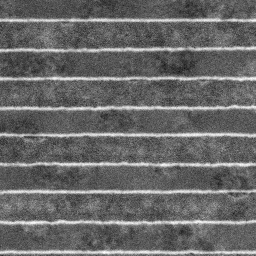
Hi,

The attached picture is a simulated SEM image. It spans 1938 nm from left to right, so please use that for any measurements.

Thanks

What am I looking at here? lines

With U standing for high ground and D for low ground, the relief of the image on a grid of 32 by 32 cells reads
UUUUUUUUUUUUUUUUUUUUUUUUUUUUUUUU
UUUUUUUUUUUUUUUUUUUUUUUUUUUUUUUU
DDDDDDDDDDDDDDDDDDDDDDDDDDDDDDDD
DDDDDDDDDDDDDDDDDDDDDDDDDDDDDDDD
DDDDDDDDDDDDDDDDDDDDDDDDDDDDDDDD
DDDDDDDDDDDDDDDDDDDDDDDDDDDDDDDD
UUUUUUUUUUUUUUUUUUUUUUUUUUUUUUUU
UUUUUUUUUUUUUUUUUUUUUUUUUUUUUUUU
UUUUUUUUUUUUUUUUUUUUUUUUUUUUUUUU
UUUUUUUUUUUUUUUUUUUUUUUUUUUUUUUU
DDDDDDDDDDDDDDDDDDDDDDDDDDDDDDDD
DDDDDDDDDDDDDDDDDDDDDDDDDDDDDDDD
DDDDDDDDDDDDDDDDDDDDDDDDDDDDDDDD
DDDDDDDDDDDDDUUUUDDUDDDDDDDUUUUU
UUUUUUUUUUUUUUUUUUUUUUUUUUUUUUUU
UUUUUUUUUUUUUUUUUUUUUUUUUUUUUUUU
UUUUUUUUUUUUUUUUUUUUUUUUUUUUUUUU
DDDDDDDDDDDDDDDDDDDDDDDDDDDDDDDD
DDDDDDDDDDDDDDDDDDDDDDDDDDDDDDDD
DDDDDDDDDDDDDDDDDDDDDDDDDDDDDDDD
DDDDUUUUDDDDDDDUDDDDDDDDDDDDDDDD
UUUUUUUUUUUUUUUUUUUUUUUUUUUUUUUU
UUUUUUUUUUUUUUUUUUUUUUUUUUUUUUUU
UUUUUUUUUUUUUUUUUUUUUUUUUUUUUUUU
DDDDDDDDDDDDDDDDDDDDDDDDDDDDDDDD
DDDDDDDDDDDDDDDDDDDDDDDDDDDDDDDD
DDDDDDDDDDDDDDDDDDDDDDDDDDDDDDDD
DDDDDDDDDDDDDDDDDDDDDDDDDDDDDDDD
UUUUUUUUUUUUUUUUUUUUUUUUUUUUUUUU
UUUUUUUUUUUUUUUUUUUUUUUUUUUUUUUU
UUUUUUUUUUUUUUUUUUUUUUUUUUUUUUUU
UUUUUUUUUUUUUUUUUUUUUUUUUUUUUUUU